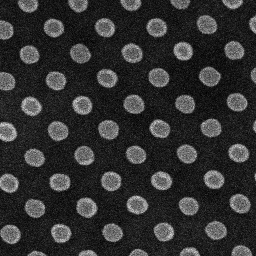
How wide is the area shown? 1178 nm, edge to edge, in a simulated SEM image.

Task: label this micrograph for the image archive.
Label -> a regular array of raised bodies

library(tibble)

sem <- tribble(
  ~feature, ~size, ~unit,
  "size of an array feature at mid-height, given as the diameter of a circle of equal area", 87.9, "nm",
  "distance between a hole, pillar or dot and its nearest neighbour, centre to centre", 164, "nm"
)